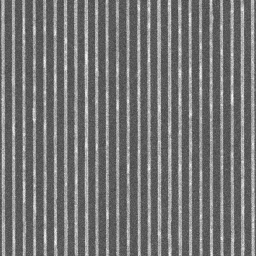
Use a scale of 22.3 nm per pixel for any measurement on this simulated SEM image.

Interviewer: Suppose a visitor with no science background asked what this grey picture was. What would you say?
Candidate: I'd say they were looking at parallel lines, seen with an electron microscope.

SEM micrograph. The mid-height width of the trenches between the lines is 179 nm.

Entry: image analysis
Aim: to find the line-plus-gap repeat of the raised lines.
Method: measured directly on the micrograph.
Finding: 232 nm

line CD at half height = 55.8 nanometers